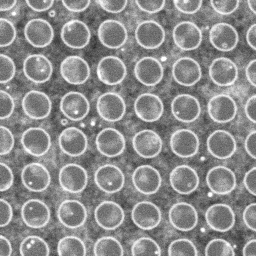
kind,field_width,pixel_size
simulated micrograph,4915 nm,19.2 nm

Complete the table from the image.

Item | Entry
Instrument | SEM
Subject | a regular array of raised bodies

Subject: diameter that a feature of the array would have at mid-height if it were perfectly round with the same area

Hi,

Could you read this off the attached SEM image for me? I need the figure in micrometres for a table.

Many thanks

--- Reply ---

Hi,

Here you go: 0.532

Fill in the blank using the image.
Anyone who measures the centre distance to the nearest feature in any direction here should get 687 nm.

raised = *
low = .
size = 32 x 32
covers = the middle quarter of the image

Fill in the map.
******...******...******...*****
******..*******...*******..*****
******...******...*******..*****
******...******...******....****
.****.....****.....****......***
................................
................................
.***......***...................
*****....*****....******....****
******...******...******...*****
******..*******...*******..*****
******...******...*******..*****
******...******...******...*****
.****.....****.....*****....****
................................
....*...........................
****......***...................
*****....*****....*****....*****
.****...*******...******...*****
******..*******..*******...*****
******..*******..*******...*****
*****....******...******...*****
.***......****.....****.....****
................................
................................
.***......**....................
*****....*****....*****.....****
*****...*******...******...*****
******..*******..*******...*****
******..*******..*******...*****
*****....******...******...*****
.***......****.....****.....****